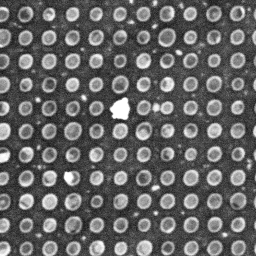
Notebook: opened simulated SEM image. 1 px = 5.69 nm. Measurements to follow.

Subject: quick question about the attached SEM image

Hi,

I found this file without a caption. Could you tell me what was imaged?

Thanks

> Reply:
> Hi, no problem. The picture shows a regular array of raised bodies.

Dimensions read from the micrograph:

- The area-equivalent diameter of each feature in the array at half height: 74.9 nm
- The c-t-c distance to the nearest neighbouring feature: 131 nanometers